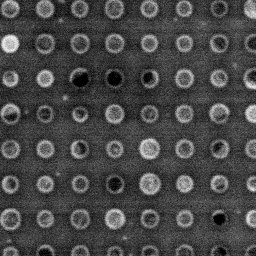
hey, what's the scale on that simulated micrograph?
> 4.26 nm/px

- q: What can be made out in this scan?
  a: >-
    a regular array of raised bodies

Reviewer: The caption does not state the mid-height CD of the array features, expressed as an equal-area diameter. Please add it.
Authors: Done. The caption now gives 15.8 px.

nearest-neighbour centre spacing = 0.148 micrometres